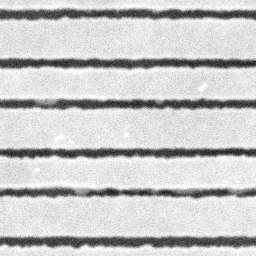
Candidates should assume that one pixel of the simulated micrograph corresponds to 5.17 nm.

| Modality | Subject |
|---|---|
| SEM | lines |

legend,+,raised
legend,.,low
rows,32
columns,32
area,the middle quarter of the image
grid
................................
++++++++++++++++.+++++++++++++++
++++++++++++++++++++++++++++++++
++++++++++++++++++++++++++++++++
++++++++++++++++++++++++++++++++
++++++++++++++++++++++++++++++++
++++++++++++++++++++++++++++++++
++++++++++++++++++++++++++++++++
++++++++++++++++++++++++++++++++
................................
................................
+++++.+.++++++++++++++++++++++++
++++++++++++++++++++++++++++++++
++++++++++++++++++++++++++++++++
++++++++++++++++++++++++++++++++
++++++++++++++++++++++++++++++++
++++++++++++++++++++++++++++++++
++++++++++++++++++++++++++++++++
++++++++++++++++++++++++++++++++
++++++++++++++++++++++++++++++++
++++++++++++++++++++++++++++++++
................................
................................
...++.....++++++.++++++.+...+++.
++++++++++++++++++++++++++++++++
++++++++++++++++++++++++++++++++
++++++++++++++++++++++++++++++++
++++++++++++++++++++++++++++++++
++++++++++++++++++++++++++++++++
++++++++++++++++++++++++++++++++
++++++++++++++++++++++++++++++++
................................